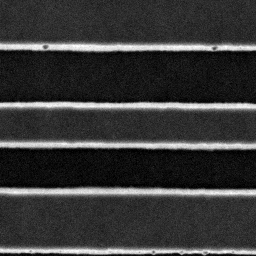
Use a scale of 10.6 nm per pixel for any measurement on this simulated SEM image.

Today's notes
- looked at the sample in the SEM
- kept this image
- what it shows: lines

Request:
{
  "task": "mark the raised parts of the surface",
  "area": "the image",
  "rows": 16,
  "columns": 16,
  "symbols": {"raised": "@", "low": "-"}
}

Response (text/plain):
@@@@@@@@@@@@@@@@
@@@@@@@@@@@@@@@@
@@@@@@@@@@@@@@@@
----------------
----------------
----------------
----------------
@@@@@@@@@@@@@@@@
@@@@@@@@@@@@@@@@
----------------
----------------
----------------
@@@@@@@@@@@@@@@@
@@@@@@@@@@@@@@@@
@@@@@@@@@@@@@@@@
@@@@@@@@@@@@@@@@